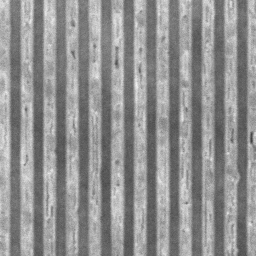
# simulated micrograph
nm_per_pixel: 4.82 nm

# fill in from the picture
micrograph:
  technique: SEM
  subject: parallel lines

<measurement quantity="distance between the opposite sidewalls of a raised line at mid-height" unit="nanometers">53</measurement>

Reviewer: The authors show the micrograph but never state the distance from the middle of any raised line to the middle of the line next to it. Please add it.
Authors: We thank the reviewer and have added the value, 109 nanometres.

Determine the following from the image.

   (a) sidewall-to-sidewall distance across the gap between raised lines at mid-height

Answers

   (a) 57.8 nanometres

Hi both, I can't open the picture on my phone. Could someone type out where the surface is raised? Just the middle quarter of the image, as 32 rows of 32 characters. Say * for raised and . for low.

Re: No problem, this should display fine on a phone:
.**....**...***...**...***...***
.**....**...***...**...***...***
.**....**...***...**...***...***
.**....**...***...**...***...***
.**....**...***...**...***...***
.**....**...***...**...***...***
.**....**...***...**....**...***
.**....**...***...**....**...***
.**....**...***...**....**...***
.**....**...***...**....**...***
.**....**...***...**...***...***
.**....**...***...**...***...***
.**....**...***...**...***...***
.**....**...***...**...***...***
.**....**...***...**...***...***
.**....**...***...**...***...***
.**....**...***...**...***...***
.**....**...***...**....**...***
.**....**...***...**....**...***
.**....**...***...**....**...***
.**....**...***...**....**...***
.**....**...***...**....**...***
.**....**...***...**....**...***
.**....**...***...**....**...***
.**....**...***...**....**...***
.**....**...***...**....**...***
.**....**...***...**....**...***
.**....**...***...**....**...***
.**....**...***...**....**...***
.**....**...***...**....**...***
.**....**...***...**....**...***
.**....**...***...**....**...***